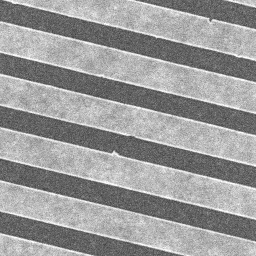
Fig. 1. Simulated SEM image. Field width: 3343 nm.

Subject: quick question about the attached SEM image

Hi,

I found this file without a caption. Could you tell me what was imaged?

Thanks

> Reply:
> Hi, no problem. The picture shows parallel lines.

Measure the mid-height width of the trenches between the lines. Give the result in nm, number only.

287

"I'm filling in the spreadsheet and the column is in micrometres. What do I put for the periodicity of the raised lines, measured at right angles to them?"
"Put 0.673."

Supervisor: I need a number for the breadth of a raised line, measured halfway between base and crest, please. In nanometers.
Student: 388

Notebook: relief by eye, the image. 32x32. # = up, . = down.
..################............##
.......###############..........
...........###############......
###............################.
########...........#############
############...........#########
################...........#####
....################............
........################........
#...........#################...
#####...........################
#########............###########
#############............#######
..###############............###
......################..........
..........################......
##............################..
######............##############
###########............#########
###############............#####
...################............#
.......################.........
...........################.....
####............###############.
########............############
############............########
################............####
.....###############............
.........################.......
#............################...
#####............###############
#########............###########